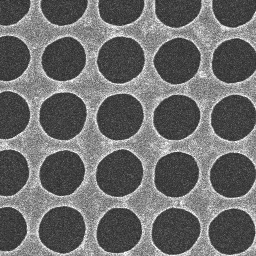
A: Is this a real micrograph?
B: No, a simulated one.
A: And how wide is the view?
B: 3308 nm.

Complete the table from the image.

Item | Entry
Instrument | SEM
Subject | a regular array of holes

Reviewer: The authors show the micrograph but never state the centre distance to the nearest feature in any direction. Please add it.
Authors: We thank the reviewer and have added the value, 731 nanometres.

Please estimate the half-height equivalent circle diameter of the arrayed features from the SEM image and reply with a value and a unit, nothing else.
606 nanometres